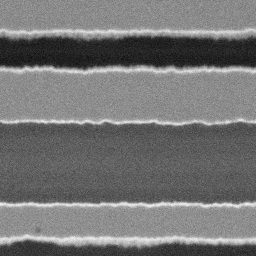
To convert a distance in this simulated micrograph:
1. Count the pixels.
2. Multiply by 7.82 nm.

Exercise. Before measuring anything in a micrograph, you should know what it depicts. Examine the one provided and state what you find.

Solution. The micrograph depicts lines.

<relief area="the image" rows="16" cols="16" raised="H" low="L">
HHHHHHHHHHHHHHHH
HHHHHHHHHHHHHHHH
LLLLLLLLLLLLLLLL
LLLLLLLLLLLLLLLL
HHHHHHHHHHHHHHHH
HHHHHHHHHHHHHHHH
HHHHHHHHHHHHHHHH
HHHHHHHHHHHHHHHH
LLLLLLLLLLLLLLLL
LLLLLLLLLLLLLLLL
LLLLLLLLLLLLLLLL
LLLLLLLLLLLLLLLL
LLLLLLLLLLLLLLLL
HHHHHHHHHHHHHHHH
HHHHHHHHHHHHHHHH
LLLLLLLLLLLLLLLL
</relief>